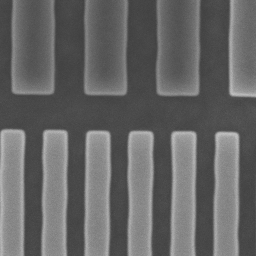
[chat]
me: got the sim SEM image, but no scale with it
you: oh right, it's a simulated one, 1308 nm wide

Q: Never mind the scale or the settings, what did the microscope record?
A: groups of lines, slits or small figures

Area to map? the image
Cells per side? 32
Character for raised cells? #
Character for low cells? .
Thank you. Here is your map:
..#####....#####....#####....###
..#####....#####....#####....###
..#####....#####....#####....###
..#####....#####....#####....###
..#####....#####....#####....###
..#####....#####....#####....###
..#####....#####....#####....###
..#####....#####....#####....###
..#####....#####....#####....###
..#####....#####....#####....###
..#####....#####....#####....###
..####.....#####....#####....###
................................
................................
................................
................................
###...##...##....##.............
###...##...###..###...##...###..
###..###...###..###...##...###..
###..###...###..###...##...###..
###..###...###..###...##...###..
###...##...###..###...##...###..
###..###...###..###...##...###..
###..###...###..###...##...###..
###..###...###..###...##...###..
###..###...###..###...##...###..
###..###...###..###...##...###..
###..###...###..###..###...###..
###..###...###..###..###...###..
###..###...###..###...##...###..
###..###...###..###..###...###..
###..###...##...###..###...###..